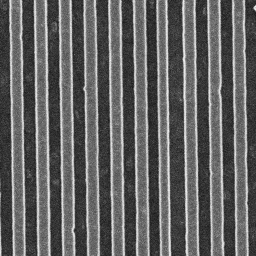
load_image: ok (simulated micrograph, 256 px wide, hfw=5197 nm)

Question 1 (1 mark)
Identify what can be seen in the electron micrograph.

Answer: parallel lines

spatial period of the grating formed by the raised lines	503	nm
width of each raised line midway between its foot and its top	0.241	um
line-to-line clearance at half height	0.259	um